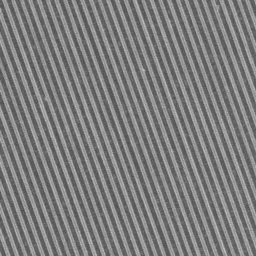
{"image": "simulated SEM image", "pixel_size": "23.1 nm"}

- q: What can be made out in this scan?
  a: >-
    parallel lines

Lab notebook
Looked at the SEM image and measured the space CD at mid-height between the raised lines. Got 0.122 micrometres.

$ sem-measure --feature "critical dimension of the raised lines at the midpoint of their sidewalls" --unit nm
67.9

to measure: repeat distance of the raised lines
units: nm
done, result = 189